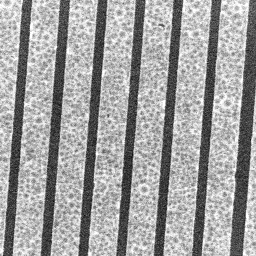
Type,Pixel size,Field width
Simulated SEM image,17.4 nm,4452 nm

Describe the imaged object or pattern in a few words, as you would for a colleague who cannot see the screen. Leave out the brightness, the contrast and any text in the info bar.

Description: parallel lines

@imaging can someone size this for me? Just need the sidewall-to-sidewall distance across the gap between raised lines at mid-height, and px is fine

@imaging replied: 10.3